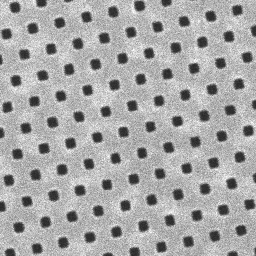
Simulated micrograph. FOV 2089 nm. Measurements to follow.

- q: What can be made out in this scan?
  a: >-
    a regular array of holes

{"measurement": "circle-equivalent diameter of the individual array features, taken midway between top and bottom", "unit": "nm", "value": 96.6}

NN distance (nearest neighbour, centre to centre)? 221 nanometers